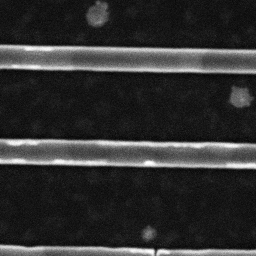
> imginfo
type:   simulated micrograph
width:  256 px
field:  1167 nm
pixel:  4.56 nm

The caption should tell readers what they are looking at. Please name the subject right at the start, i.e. one or a few lines or trenches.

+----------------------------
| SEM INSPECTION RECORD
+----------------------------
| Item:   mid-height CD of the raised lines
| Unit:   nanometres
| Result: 102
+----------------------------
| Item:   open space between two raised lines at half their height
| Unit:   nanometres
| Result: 354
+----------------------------